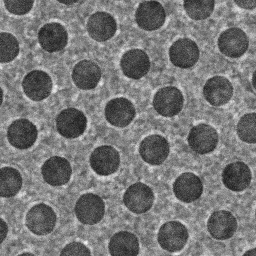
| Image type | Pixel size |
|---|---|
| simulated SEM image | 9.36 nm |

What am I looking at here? a regular array of holes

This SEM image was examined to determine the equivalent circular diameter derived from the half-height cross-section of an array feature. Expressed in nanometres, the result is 296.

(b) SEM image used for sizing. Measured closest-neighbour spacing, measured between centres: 0.468 um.